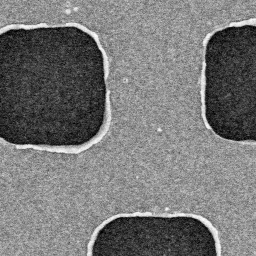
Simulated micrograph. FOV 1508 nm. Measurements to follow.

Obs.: holes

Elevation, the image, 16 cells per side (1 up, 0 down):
1111111111111111
1111111111111111
0000001111111000
0000001111111000
0000001111111000
0000000111111000
0000000111111000
0000000111111000
0000001111111100
1111111111111111
1111111111111111
1111111111111111
1111111111111111
1111111111111111
1111110000000111
1111110000000111